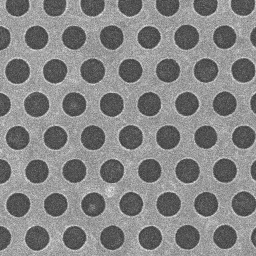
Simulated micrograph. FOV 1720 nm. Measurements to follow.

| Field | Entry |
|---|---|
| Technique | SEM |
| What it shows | a regular array of holes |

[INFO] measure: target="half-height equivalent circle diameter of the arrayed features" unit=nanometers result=165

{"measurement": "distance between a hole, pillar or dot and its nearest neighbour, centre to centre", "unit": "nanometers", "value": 251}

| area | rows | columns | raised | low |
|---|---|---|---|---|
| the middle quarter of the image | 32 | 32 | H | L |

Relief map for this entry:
LHHHLLLLLLHHHHLLLLLHHHHLLLLLLHHH
LHHHLLLLLLHHHHLLLLLLHHHLLLLLLHHH
LHHHLLLLLLHHHHLLLLLLHHHLLLLLLHHH
HHHHHLLLLLHHHHLLLLLHHHHLLLLLLHHH
HHHHHHLLLHHHHHHLLLHHHHHHHLLHHHHH
HHHHHHHHHHHHHHHHHHHHHHHHHHHHHHHH
HHHHHHHHHHHHHHHHHHHHHHHHHHHHHHHH
HLLLHHHHHHLLLHHHHHHHLLLHHHHHHLLL
LLLLLHHHHLLLLLLHHHHLLLLLHHHHLLLL
LLLLLHHHHLLLLLLHHHLLLLLLHHHHLLLL
LLLLLLHHHLLLLLLHHHLLLLLLHHHHLLLL
LLLLLHHHHLLLLLLHHHLLLLLLHHHHLLLL
HLLLLHHHHHLLLLHHHHHHLLLHHHHHHLLL
HHHHHHHHHHHHHHHHHHHHHHHHHHHHHHHH
HHHHHHHHHHHHHHHHHHHHHHHHHHHHHHHH
HHHHHHLLHHHHHHHLLLHHHHHHHLLLHHHH
HHHHHLLLLLHHHHLLLLLHHHHHLLLLLHHH
LHHHLLLLLLHHHHLLLLLLHHHLLLLLLHHH
LHHHLLLLLLLHHLLLLLLLHHHLLLLLLHHH
LHHHLLLLLLHHHHLLLLLLHHHLLLLLLHHH
HHHHHLLLLLHHHHLLLLLHHHHHLLLLHHHH
HHHHHHLLHHHHHHHHLHHHHHHHHLHHHHHH
HHHHHHHHHHHHHHHHHHHHHHHHHHHHHHHH
HHHHHHHHHHHHHHHHHHHHHHHHHHHHHHLL
HLLLLHHHHHLLLLHHHHHLLLLLHHHHHLLL
LLLLLLHHHLLLLLLHHHHLLLLLHHHHLLLL
LLLLLLHHHLLLLLLHHHLLLLLLHHHHLLLL
LLLLLLHHHLLLLLLHHHHLLLLLHHHHLLLL
LLLLLHHHHLLLLLHHHHHLLLLLHHHHLLLL
HLLLHHHHHHHLLHHHHHHHLLHHHHHHHLLL
HHHHHHHHHHHHHHHHHHHHHHHHHHHHHHHH
HHHHHHHHHHHHHHHHHHHHHHHHHHHHHHHH